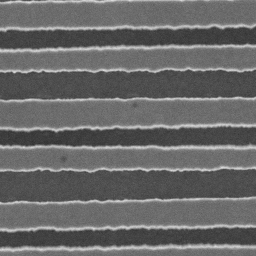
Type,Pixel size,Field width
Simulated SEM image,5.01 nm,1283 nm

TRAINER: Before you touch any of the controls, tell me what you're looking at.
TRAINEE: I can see lines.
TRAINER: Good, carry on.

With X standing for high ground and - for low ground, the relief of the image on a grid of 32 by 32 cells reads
XXXXXXXXXXXXXXXXXXXXXXXXXXXXXXXX
XXXXXXXXXXXXXXXXXXXXXXXXXXXXXXXX
XXXXXXXXXXXXXXXXXXXXXXXXXXXXXXXX
X-XXXXXXXXXXXX----X-------------
--------------------------------
--------------------------------
XXXXXXXXXXXXXXXXXXXXXXXXXXXXXXXX
XXXXXXXXXXXXXXXXXXXXXXXXXXXXXXXX
XXXXXXXXXXXXXXXXXXXXXXXXXXXXXXXX
--------------------------------
--------------------------------
--------------------------------
---XX--X-XXXXXXXXXXXXXXXXXXXXXXX
XXXXXXXXXXXXXXXXXXXXXXXXXXXXXXXX
XXXXXXXXXXXXXXXXXXXXXXXXXXXXXXXX
XXXXXXXXXXXXXXXXXXXXXXXXXXXXXXXX
--------------------------------
--------------------------------
XXXXXXXXX-X-XXXXXXXX--XXX--XX--X
XXXXXXXXXXXXXXXXXXXXXXXXXXXXXXXX
XXXXXXXXXXXXXXXXXXXXXXXXXXXXXXXX
--------------------------------
--------------------------------
--------------------------------
--------------------------------
XXXXXXXXXXXXXXXXXXXXXXXXXXXXXXXX
XXXXXXXXXXXXXXXXXXXXXXXXXXXXXXXX
XXXXXXXXXXXXXXXXXXXXXXXXXXXXXXXX
XXXXXXXXXXXXXXXX----------------
--------------------------------
--------------------------------
XXXXXXXXXXXXXXXXXXXXXXXXXXXXXXXX